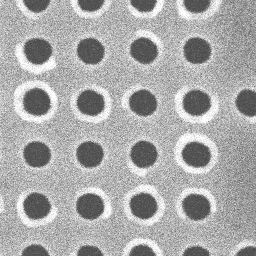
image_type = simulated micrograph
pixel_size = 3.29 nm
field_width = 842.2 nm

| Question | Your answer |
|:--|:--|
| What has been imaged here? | a regular array of holes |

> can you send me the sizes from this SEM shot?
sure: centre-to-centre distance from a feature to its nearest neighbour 51.6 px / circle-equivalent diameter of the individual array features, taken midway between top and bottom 0.0893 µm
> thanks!